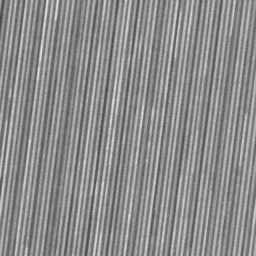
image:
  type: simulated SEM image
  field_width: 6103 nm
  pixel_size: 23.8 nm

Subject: parallel lines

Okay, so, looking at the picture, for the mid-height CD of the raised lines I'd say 41.4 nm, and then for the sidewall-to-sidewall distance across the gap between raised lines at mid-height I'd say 85.7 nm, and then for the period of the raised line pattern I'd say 123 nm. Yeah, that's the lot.